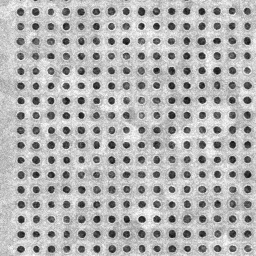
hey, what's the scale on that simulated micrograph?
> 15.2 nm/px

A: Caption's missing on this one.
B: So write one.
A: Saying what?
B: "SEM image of a regular array of holes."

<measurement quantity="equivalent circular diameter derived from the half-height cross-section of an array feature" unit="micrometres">0.119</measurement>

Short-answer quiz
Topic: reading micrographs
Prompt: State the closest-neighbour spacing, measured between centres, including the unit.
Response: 223 nm